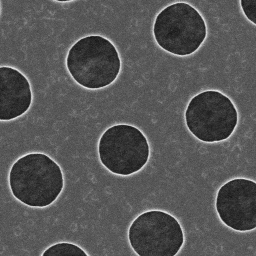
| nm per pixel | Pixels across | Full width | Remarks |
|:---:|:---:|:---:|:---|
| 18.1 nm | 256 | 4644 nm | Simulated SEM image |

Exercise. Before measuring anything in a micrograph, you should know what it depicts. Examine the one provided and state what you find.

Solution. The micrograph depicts holes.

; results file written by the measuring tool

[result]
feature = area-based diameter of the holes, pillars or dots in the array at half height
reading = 934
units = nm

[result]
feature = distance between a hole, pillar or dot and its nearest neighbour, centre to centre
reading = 1680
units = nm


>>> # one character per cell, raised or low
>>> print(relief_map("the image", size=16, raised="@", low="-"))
@@@@@@@@@@--@@@-
@@@@@@@@@@---@@@
@@@@@--@@@---@@@
@@@@---@@@@@@@@@
-@@@---@@@@@@@@@
--@@@@@@@@@@@@@@
--@@@@@@@@@@---@
@@@@@@@@@@@@---@
@@@@@@---@@@--@@
@@@@@@---@@@@@@@
@---@@@--@@@@@@@
@---@@@@@@@@@@--
@--@@@@@@@@@@@--
@@@@@@@@@--@@@--
@@@@@@@@---@@@@@
@@@--@@@---@@@@@